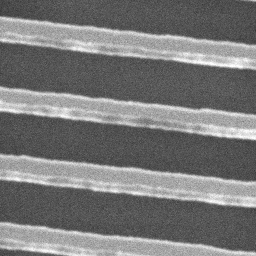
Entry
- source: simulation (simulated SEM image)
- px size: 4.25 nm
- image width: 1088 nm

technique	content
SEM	lines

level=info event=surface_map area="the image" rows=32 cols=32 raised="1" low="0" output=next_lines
00000000000000000000000000000000
00000000000000000000000000000000
11100000000000000000000000000000
11111111111100000000000000000000
11111111111111111111110000000000
00011111111111111111111111111100
00000000000111111111111111111111
00000000000000000000001111111111
00000000000000000000000000000001
00000000000000000000000000000000
00000000000000000000000000000000
11110000000000000000000000000000
11111111111110000000000000000000
11111111111111111111111000000000
00000011111111111111111111111111
00000000000000011111111111111111
00000000000000000000000111111111
00000000000000000000000000000000
00000000000000000000000000000000
11100000000000000000000000000000
11111111111000000000000000000000
11111111111111111110000000000000
00111111111111111111111111110000
00000000001111111111111111111111
00000000000000000001111111111111
00000000000000000000000000011111
00000000000000000000000000000000
00000000000000000000000000000000
11111100000000000000000000000000
11111111111110000000000000000000
11111111111111111111111000000000
00000011111111111111111111111110